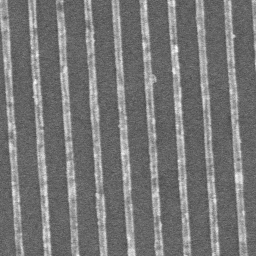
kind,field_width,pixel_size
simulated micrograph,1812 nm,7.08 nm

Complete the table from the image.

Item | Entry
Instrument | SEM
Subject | parallel lines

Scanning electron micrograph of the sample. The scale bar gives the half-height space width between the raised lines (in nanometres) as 155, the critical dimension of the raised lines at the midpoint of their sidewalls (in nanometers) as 44.1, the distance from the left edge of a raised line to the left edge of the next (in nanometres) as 198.